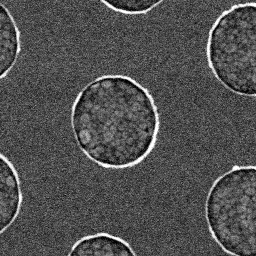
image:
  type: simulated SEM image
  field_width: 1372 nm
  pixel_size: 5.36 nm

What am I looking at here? holes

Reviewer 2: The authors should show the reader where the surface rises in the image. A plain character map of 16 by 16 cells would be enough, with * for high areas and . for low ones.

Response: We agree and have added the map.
*******..******.
.*************..
.************...
.************...
*************...
*****....*****..
*****....*******
*****.....******
*****.....******
*****....*******
.***************
.************...
.************...
.************...
*************...
*****...******..